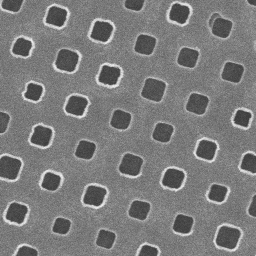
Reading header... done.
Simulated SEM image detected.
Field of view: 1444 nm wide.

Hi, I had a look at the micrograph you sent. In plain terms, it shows a regular array of holes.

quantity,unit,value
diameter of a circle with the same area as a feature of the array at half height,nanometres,116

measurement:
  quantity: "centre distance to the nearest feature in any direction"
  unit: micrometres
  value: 0.252